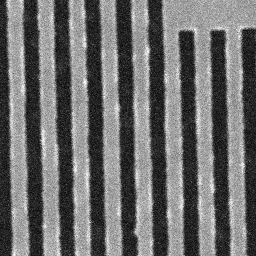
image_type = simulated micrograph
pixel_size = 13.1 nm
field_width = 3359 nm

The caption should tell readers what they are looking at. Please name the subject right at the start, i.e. parallel lines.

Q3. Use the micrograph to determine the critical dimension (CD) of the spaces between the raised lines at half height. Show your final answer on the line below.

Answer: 218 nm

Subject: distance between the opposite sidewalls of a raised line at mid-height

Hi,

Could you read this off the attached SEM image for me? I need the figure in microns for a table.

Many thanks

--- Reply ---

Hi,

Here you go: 0.194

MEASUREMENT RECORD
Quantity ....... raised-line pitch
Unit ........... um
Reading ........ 0.408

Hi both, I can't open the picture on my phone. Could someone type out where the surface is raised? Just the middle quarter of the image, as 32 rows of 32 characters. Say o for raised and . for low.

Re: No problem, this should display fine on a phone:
..ooo.....ooo.....ooo....oooo...
..ooo.....ooo.....ooo....oooo...
..ooo.....ooo.....ooo....oooo...
..ooo.....ooo.....ooo....oooo...
..oooo....ooo.....ooo....oooo...
..oooo....ooo.....ooo....oooo...
..oooo....ooo.....ooo.....ooo...
..oooo....ooo.....ooo....oooo...
..oooo....ooo.....ooo.....ooo...
..oooo....ooo.....ooo.....ooo...
..oooo....ooo.....ooo.....ooo...
..oooo....oooo....ooo.....ooo...
..oooo....ooo.....ooo.....ooo...
..oooo....oooo....ooo.....ooo...
..oooo....oooo....ooo....oooo...
..oooo....oooo....ooo....oooo...
..oooo....oooo....ooo.....ooo...
..oooo....oooo....ooo.....ooo...
..oooo....oooo....ooo.....ooo...
..oooo....oooo....ooo.....ooo...
..oooo....oooo....ooo.....ooo...
..oooo....oooo....ooo.....ooo...
..oooo....oooo....ooo.....ooo...
..oooo....oooo....ooo.....ooo...
..oooo....oooo....oooo....ooo...
...ooo....oooo....oooo....ooo...
...ooo....oooo....oooo....ooo...
...ooo....oooo....oooo....ooo...
...ooo....oooo....oooo....ooo...
...ooo....oooo....oooo....ooo...
...ooo....oooo....oooo....ooo...
...ooo....oooo....oooo....oooo..